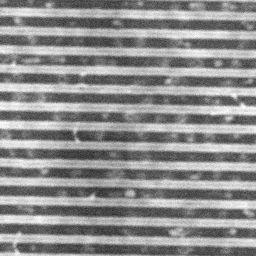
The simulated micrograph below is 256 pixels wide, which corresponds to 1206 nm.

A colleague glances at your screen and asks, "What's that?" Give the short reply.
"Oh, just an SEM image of parallel lines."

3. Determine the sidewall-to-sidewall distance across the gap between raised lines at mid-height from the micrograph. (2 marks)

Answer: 0.0572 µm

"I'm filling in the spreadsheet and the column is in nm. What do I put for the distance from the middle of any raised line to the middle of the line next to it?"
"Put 88.9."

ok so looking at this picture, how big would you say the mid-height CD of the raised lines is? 32.4 nanometres